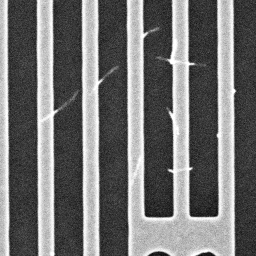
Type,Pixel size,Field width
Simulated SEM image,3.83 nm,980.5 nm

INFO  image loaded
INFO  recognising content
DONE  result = groups of lines, slits or small figures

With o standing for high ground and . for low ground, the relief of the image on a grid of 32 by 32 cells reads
o....oo...oo....oo....o....oo...
o....oo...oo....oo....o....oo...
o....oo...oo....oo....o....oo...
o....oo...oo....oo....oo...oo...
o....oo...oo....oo....oo...oo...
o....oo...oo....oo....oo...oo...
o....oo...oo....oo....o....oo...
o....oo...oo....oo...ooo...oo...
o....oo...oo....oo....oo...oo...
o....oo...oo....oo....oo...oo...
o....oo...oo....oo....oo...oo...
o....oo...oo....oo....oo...oo...
o....oo...oo....oo....oo...oo...
o....oo...oo....oo....oo...oo...
o....oo...oo....oo...ooo...oo...
o....oo...oo....oo....oo...oo...
o....oo...oo....oo....oo...oo...
o....oo...oo....oo....oo...oo...
o....oo...oo....oo....oo...oo...
o....oo...oo....oo....oo...oo...
o....oo...oo....oo....oo...oo...
o....oo...oo....oo....oo...oo...
o....oo...oo....oo....oo...oo...
o....oo...oo....oo....oo...oo...
o....oo...oo....oo....oo...oo...
o....oo...oo....oo....oo...oo...
o....oo...oo....oo....oo...oo...
o....oo....o....ooooooooooooo...
o....oo...oo....ooooooooooooo...
o....oo...oo....ooooooooooooo...
o....oo....o....ooooooooooooo...
o....oo....o....ooo.ooooooooo...